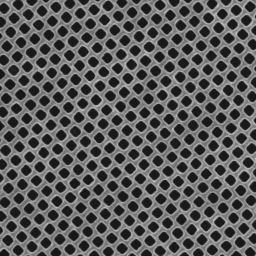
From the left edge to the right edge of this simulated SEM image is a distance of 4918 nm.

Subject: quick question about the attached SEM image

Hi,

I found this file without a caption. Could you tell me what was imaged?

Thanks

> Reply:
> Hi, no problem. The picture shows a regular array of holes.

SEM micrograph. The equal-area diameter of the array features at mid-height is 0.199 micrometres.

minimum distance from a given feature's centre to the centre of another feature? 270 nanometres